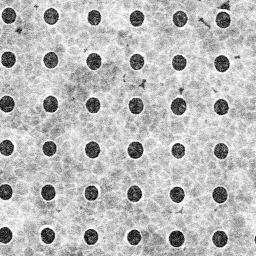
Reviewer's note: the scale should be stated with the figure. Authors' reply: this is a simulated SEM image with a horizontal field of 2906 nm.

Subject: a regular array of holes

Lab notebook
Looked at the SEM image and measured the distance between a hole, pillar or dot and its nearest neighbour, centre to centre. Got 0.287 um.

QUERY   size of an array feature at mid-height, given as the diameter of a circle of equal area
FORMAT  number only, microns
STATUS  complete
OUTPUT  0.189